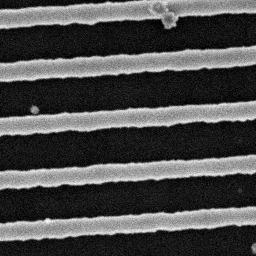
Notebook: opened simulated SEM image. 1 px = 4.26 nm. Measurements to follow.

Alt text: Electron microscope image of lines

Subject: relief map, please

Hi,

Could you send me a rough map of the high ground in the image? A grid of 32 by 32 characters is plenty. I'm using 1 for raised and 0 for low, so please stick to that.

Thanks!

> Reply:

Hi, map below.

00000000001111111111111111111111
11111111111111111111111111111111
11111111111111100000110000000000
10000000000000000000000000000000
00000000000000000000000000000000
00000000000000000000000000000000
00000000000000000000011111111111
00000111111111111111111111111111
11111111111111111111111111100000
11111111111100000000000000000000
00000000000000000000000000000000
00000000000000000000000000000000
00000000000000000000000000000000
00000000000000000000111111111111
00001111111111111111111111111111
11111111111111111111110000000000
11111100000000000000000000000000
00000000000000000000000000000000
00000000000000000000000000000000
00000000000000000000000000000001
00000000000000001111111111111111
11111111111111111111111111111111
11111111111111111100000000000000
10100000000000000000000000000000
00000000000000000000000000000000
00000000000000000000000000000000
00000000000000000000000111111111
00000111111111111111111111111111
11111111111111111111111111100000
11111111110000000000000000000000
00000000000000000000000000000000
00000000000000000000000000000000